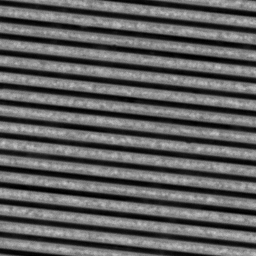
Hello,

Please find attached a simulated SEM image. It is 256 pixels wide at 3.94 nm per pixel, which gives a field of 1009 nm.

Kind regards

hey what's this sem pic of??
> parallel lines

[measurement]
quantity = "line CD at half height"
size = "0.0425 um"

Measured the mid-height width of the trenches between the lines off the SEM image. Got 23 nm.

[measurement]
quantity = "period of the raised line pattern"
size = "0.0648 micrometres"